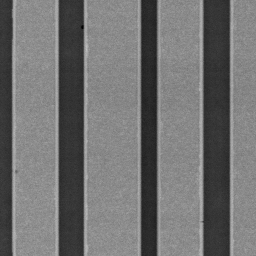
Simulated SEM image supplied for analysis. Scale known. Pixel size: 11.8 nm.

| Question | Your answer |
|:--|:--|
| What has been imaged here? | one or a few lines or trenches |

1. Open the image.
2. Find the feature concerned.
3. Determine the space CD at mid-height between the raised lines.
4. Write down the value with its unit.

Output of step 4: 0.339 microns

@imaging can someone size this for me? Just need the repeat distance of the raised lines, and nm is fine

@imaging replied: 856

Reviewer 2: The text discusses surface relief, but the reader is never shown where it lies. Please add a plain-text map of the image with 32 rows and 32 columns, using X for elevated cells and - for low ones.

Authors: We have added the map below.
--XXXXX----XXXXXX---XXXXX----XXX
--XXXXX----XXXXXX---XXXXX----XXX
--XXXXX----XXXXXX---XXXXX----XXX
--XXXXX----XXXXXX---XXXXX----XXX
--XXXXX----XXXXXX---XXXXX----XXX
--XXXXX----XXXXXX---XXXXX----XXX
--XXXXX----XXXXXX---XXXXX----XXX
--XXXXX----XXXXXX---XXXXX----XXX
--XXXXX----XXXXXX---XXXXX----XXX
--XXXXX----XXXXXX---XXXXX----XXX
--XXXXX----XXXXXX---XXXXX----XXX
--XXXXX----XXXXXX---XXXXX----XXX
--XXXXX----XXXXXX---XXXXX----XXX
--XXXXX----XXXXXX---XXXXX----XXX
--XXXXX----XXXXXX---XXXXX----XXX
--XXXXX----XXXXXX---XXXXX----XXX
--XXXXX----XXXXXX---XXXXX----XXX
--XXXXX----XXXXXX---XXXXX----XXX
--XXXXX----XXXXXX---XXXXX----XXX
--XXXXX----XXXXXX---XXXXX----XXX
--XXXXX----XXXXXX---XXXXX----XXX
--XXXXX----XXXXXX---XXXXX----XXX
--XXXXX----XXXXXX---XXXXX----XXX
--XXXXX----XXXXXX---XXXXX----XXX
--XXXXX----XXXXXX---XXXXX----XXX
--XXXXX----XXXXXX---XXXXX----XXX
--XXXXX----XXXXXX---XXXXX----XXX
--XXXXX----XXXXXX---XXXXX----XXX
--XXXXX----XXXXXX---XXXXX----XXX
--XXXXX----XXXXXX---XXXXX----XXX
--XXXXX----XXXXXX---XXXXX----XXX
--XXXXX----XXXXXX---XXXXX----XXX